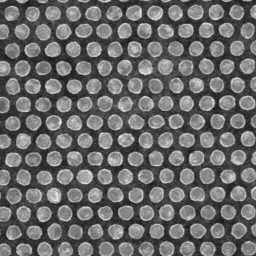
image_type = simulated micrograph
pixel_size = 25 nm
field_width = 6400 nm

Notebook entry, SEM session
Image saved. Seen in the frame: a regular array of raised bodies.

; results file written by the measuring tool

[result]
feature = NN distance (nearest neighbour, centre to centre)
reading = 0.501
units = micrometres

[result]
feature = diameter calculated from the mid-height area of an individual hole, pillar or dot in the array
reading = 359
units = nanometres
